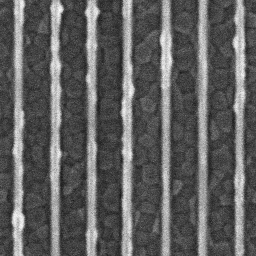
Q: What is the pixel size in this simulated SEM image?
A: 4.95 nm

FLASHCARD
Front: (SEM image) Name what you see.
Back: parallel lines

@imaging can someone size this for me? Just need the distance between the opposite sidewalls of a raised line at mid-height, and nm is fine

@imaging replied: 39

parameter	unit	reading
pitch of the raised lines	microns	0.182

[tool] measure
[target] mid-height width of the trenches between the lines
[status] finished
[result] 144 nm